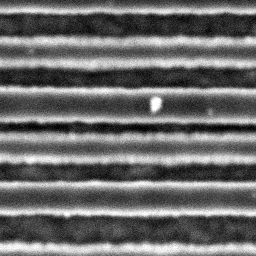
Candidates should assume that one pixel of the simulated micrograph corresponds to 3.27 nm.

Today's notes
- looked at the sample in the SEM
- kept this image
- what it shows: lines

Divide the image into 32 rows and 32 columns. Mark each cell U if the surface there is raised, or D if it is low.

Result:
UUUUUUUUUUUUUUUUUUUUUUUUUUUUUUUU
UUUUUUUUUUUUUUUUUUUUUUUUUUUUUUUU
DDDDDDDDDDDDDDDDDDDDDDDDDDDDDDDD
DDDDDDDDDDDDDDDDDDDDDDDDDDDDDDDD
DDDDDDDDDDDDDDDDDDDDDDDDDDDDDDDD
UUUUUUUUUUUUUUUUUUUUUUUUUUUUUUUU
UUUUUUUUUUUUUUUUUUUUUUUUUUUUUUUU
UUUUUUUUUUUUUUUUUUUUUUUUUUUUUUUU
DDDDDDDDDDDDDDDDDDDDDDDDDDDDDDDD
DDDDDDDDDDDDDDDDDDDDDDDDDDDDDDDD
DDDDDDDDDDDDDDDDDDDDDDDDDDDDDDDD
UUUUUUUUUUUUUUUUUUUUUUUUUUUUUUUU
UUUUUUUUUUUUUUUUUUUUUUUUUUUUUUUU
UUUUUUUUUUUUUUUUUUUUUUUUUUUUUUUU
UUUUUUUUUUUUUUUUUUUUUUUUUUUUUUUU
DDDDDDDDDDDDDDDDDDDDDDDDDDDDDDDD
DDDDDDDDDDDDDDDDDDDDDDDDDDDDDDDD
UUUUUUUUUUUUUUUUUUUUUUUUUUUUUUUU
UUUUUUUUUUUUUUUUUUUUUUUUUUUUUUUU
UUUUUUUUUUUUUUUUUUUUUUUUUUUUUUUU
DDDDDDDDDDDDDDDDDDDDDDDDDDDDDDDD
DDDDDDDDDDDDDDDDDDDDDDDDDDDDDDDD
DDDDDDDDDDDDDDDDDDDDDDDDDDDDDDDD
UUUUUUUUUUUUUUUUUUUUUUUUUUUUUUUU
UUUUUUUUUUUUUUUUUUUUUUUUUUUUUUUU
UUUUUUUUUUUUUUUUUUUUUUUUUUUUUUUU
UUUUUUUUUUUUUUUUUUUUUUUUUUUUUUUU
DDDDDDDDDDDDDDDDDDDDDDDDDDDDDDDD
DDDDDDDDDDDDDDDDDDDDDDDDDDDDDDDD
DDDDDDDDDDDDDDDDDDDDDDDDDDDDDDDD
DDDDDDDDDDDDDDDDDDDDDDDDDDDDDDDD
UUUUUUUUUUUUUUUUUUUUUUUUUUUUUUUU